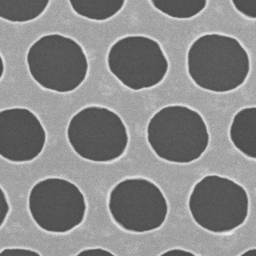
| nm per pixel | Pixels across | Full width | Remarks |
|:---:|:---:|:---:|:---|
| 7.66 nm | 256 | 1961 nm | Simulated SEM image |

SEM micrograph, a regular array of holes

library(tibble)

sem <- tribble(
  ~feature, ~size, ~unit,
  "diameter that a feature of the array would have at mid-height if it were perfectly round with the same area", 0.439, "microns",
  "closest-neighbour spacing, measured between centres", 615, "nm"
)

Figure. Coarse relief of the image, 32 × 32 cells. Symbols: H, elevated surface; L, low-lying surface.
LLLLLLHHHLLLLLLHHHHLLLLLLLHHHLLL
LLLLLHHHHHLLLLLHHHHHLLLLLHHHHHLL
HLLLHHHHHHHHLHHHHHHHHHHHHHHHHHHH
HHHHHHHHHHHHHHHHHHHHHHHHHHHHHHHH
HHHHHHLLHHHHHHHHHHHHHHHHHLLLHHHH
HHHHLLLLLLHHHHLLLLLLHHHHLLLLLLHH
HHHHLLLLLLHHHHLLLLLLHHHHLLLLLLLH
HHHLLLLLLLLHHHLLLLLLLHHLLLLLLLLH
HHHHLLLLLLLHHHLLLLLLLHHHLLLLLLLH
HHHHLLLLLLLHHHLLLLLLLHHHLLLLLLLH
HHHHHLLLLLHHHHHHLLLHHHHHHLLLLLHH
HHHHHHHHHHHHHHHHHHHHHHHHHHHLHHHH
HHHHHHHHHHHHHHHHHHHHHHHHHHHHHHHH
HHHHHHHHHHHLLHHHHHHHHLLHHHHHHHHL
LLLLHHHHHLLLLLLHHHHLLLLLLHHHHLLL
LLLLLHHHHLLLLLLHHHHLLLLLLLHHHLLL
LLLLLLHHLLLLLLLLHHLLLLLLLLHHHLLL
LLLLLLHHHLLLLLLLHHLLLLLLLLHHHLLL
LLLLLHHHHLLLLLLLHHHLLLLLLLHHHHLL
LLLLLHHHHHLLLLLHHHHHLLLLLHHHHHHL
HHHHHHHHHHHHHHHHHHHHHHHHHHHHHHHH
HHHHHHHHHHHHHHHHHHHHHHHHHHHHHHHH
HHHHHLLLHHHHHHHHLLHHHHHHHLLLLHHH
HHHHLLLLLLHHHHLLLLLLHHHHLLLLLLHH
LHHHLLLLLLHHHHLLLLLLHHHHLLLLLLLH
LHHHLLLLLLLHHHLLLLLLLHHHLLLLLLLH
LHHHLLLLLLLHHHLLLLLLLHHHLLLLLLLH
LHHHLLLLLLHHHHLLLLLLLHHHLLLLLLLH
HHHHHLLLLHHHHHHHLLLLHHHHHHLLLHHH
HHHHHHHHHHHHHHHHHHHHHHHHHHHHHHHH
HHHHHHHHHHHHHHHHHHHHHHHHHHHHHHHH
LLLLHHHHHHLLLLHHHHHHHLLHHHHHHHHL